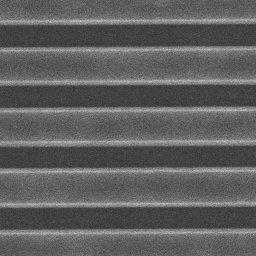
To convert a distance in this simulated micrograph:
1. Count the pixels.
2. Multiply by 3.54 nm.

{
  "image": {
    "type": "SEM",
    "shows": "one or a few lines or trenches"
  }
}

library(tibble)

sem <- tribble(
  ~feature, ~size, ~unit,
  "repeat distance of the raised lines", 215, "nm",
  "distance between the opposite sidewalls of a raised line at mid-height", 0.124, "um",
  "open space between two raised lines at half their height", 92.8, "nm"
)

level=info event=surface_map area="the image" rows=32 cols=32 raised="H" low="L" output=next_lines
HHHHHHHHHHHHHHHHHHHHHHHHHHHHHHHH
HHHHHHHHHHHHHHHHHHHHHHHHHHHHHHHH
HHHHHHHHHHHHHHHHHHHHHHHHHHHHHHHH
LLLLLLLLLLLLLLLLLLLLLLLLLLLLLLLL
LLLLLLLLLLLLLLLLLLLLLLLLLLLLLLLL
LLLLLLLLLLLLLLLLLLLLLLLLLLLLLLLL
HHHHHHHHHHHHHHHHHHHHHHHHHHHHHHHH
HHHHHHHHHHHHHHHHHHHHHHHHHHHHHHHH
HHHHHHHHHHHHHHHHHHHHHHHHHHHHHHHH
HHHHHHHHHHHHHHHHHHHHHHHHHHHHHHHH
LLLLLLLLLLLLLLLLLLLLLLLLLLLLLLLL
LLLLLLLLLLLLLLLLLLLLLLLLLLLLLLLL
LLLLLLLLLLLLLLLLLLLLLLLLLLLLLLLL
LLLLLLLLLLLLLLLLLLLLLLLLLLLLLLLL
HHHHHHHHHHHHHHHHHHHHHHHHHHHHHHHH
HHHHHHHHHHHHHHHHHHHHHHHHHHHHHHHH
HHHHHHHHHHHHHHHHHHHHHHHHHHHHHHHH
HHHHHHHHHHHHHHHHHHHHHHHHHHHHHHHH
LLLLLLLLLLLLLLLLLLLLLLLLLLLLLLLL
LLLLLLLLLLLLLLLLLLLLLLLLLLLLLLLL
LLLLLLLLLLLLLLLLLLLLLLLLLLLLLLLL
HHHHHHHHHHHHHHHHHHHHHHHHHHHHHHHH
HHHHHHHHHHHHHHHHHHHHHHHHHHHHHHHH
HHHHHHHHHHHHHHHHHHHHHHHHHHHHHHHH
HHHHHHHHHHHHHHHHHHHHHHHHHHHHHHHH
HHHHHHHHHHHHHHHHHHHHHHHHHHHHHHHH
LLLLLLLLLLLLLLLLLLLLLLLLLLLLLLLL
LLLLLLLLLLLLLLLLLLLLLLLLLLLLLLLL
LLLLLLLLLLLLLLLLLLLLLLLLLLLLLLLL
HHHHHHHHHHHHHHHHHHHHHHHHHHHHHHHH
HHHHHHHHHHHHHHHHHHHHHHHHHHHHHHHH
HHHHHHHHHHHHHHHHHHHHHHHHHHHHHHHH